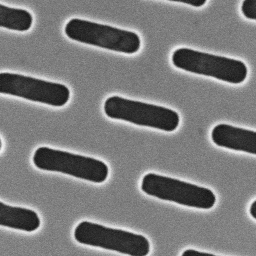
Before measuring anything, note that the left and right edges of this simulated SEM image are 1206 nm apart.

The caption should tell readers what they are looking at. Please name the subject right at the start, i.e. holes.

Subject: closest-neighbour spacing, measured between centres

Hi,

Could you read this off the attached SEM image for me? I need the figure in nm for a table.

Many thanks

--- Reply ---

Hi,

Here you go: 405